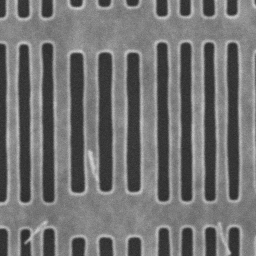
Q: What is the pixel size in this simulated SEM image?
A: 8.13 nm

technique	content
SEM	groups of lines, slits or small figures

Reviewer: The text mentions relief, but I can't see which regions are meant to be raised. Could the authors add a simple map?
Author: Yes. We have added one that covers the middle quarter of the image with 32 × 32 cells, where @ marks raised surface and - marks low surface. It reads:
@----@@@----@@@@---@@@@---@@@---
@----@@@----@@@@---@@@@---@@@---
@----@@@----@@@----@@@@---@@@---
@----@@@----@@@----@@@@---@@@---
@----@@@----@@@----@@@@---@@@---
@----@@@----@@@----@@@@---@@@---
@----@@@----@@@@---@@@@---@@@---
@----@@@----@@@@---@@@@---@@@---
@----@@@----@@@@---@@@@---@@@---
@----@@@----@@@@---@@@@---@@@---
@----@@@----@@@@---@@@@---@@@---
@----@@@----@@@@---@@@@---@@@---
@----@@@----@@@@---@@@@---@@@---
@----@@@----@@@@---@@@@---@@@---
@----@@@----@@@@---@@@@----@@---
@----@@@----@@@@---@@@@---@@@---
@----@@@----@@@@---@@@@---@@@---
@----@@@----@@@@---@@@@---@@@---
@----@@@----@@@@---@@@@---@@@---
@----@@@----@@@@---@@@@----@@---
@----@@@----@@@----@@@@----@@---
@@---@@@----@@@----@@@@----@@---
@@---@@@----@@@----@@@@----@@---
@@---@@@----@@@----@@@@----@@---
@@---@@@----@@@----@@@@----@@---
@@---@@@----@@@----@@@@----@@---
@@---@@@----@@@@---@@@@----@@---
@@---@@@----@@@@---@@@@----@@---
@@---@@@----@@@@---@@@@----@@---
@@---@@@----@@@@---@@@@----@@---
@@---@@@@---@@@@---@@@@----@@---
@@---@@@@---@@@@---@@@@----@@---